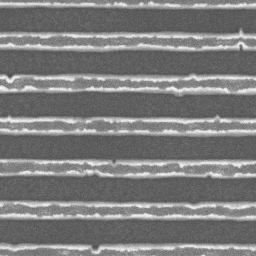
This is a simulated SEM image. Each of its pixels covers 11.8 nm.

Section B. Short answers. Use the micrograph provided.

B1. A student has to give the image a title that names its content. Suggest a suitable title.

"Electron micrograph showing parallel lines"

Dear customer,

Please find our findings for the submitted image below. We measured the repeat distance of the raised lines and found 500 nanometres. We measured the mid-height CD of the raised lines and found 185 nm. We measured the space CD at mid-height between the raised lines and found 312 nanometers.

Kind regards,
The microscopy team